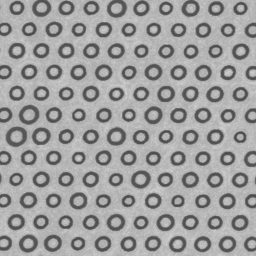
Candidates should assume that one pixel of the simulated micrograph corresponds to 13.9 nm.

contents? a regular array of ring-shaped grooves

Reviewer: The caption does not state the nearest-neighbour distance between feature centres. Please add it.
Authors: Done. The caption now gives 340 nm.